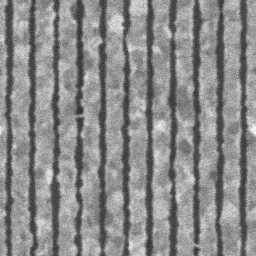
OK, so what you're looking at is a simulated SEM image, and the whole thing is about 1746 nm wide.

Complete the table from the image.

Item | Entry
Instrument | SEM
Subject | parallel lines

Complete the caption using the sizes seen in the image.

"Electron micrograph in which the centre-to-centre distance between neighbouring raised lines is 160 nm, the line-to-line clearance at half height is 7.38 px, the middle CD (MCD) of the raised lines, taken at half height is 111 nanometers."